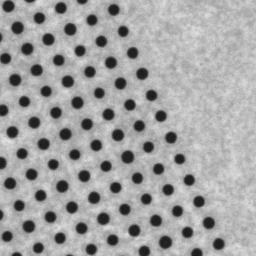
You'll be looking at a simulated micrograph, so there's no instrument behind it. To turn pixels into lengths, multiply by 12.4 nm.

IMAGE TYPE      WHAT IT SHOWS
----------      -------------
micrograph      a regular array of holes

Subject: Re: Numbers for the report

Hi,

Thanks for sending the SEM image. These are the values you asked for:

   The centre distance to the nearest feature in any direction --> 286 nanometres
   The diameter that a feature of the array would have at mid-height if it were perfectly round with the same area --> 143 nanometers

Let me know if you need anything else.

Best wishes